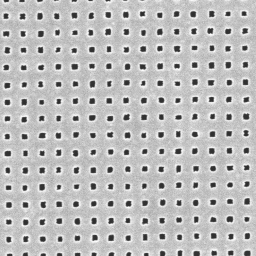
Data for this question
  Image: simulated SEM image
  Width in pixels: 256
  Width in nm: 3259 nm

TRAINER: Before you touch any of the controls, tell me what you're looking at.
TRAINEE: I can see a regular array of holes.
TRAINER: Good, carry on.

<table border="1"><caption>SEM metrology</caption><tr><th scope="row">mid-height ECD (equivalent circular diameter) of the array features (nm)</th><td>82.5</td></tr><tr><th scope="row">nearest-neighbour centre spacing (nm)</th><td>209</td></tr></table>